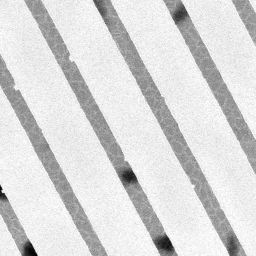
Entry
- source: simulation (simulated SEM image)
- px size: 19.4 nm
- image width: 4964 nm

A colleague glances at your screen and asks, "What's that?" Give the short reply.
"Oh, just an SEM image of one or a few lines or trenches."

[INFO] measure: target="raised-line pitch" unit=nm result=1190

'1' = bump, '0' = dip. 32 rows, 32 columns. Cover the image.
11100111111100111111100111111001
11110011111100011111100111111100
11110001111110011111110011111100
11111001111110001111110011111110
11111000111111001111111001111110
11111100111111100111111000111111
11111100011111100111111100111111
11111110011111100011111100011111
01111110001111110011111110011111
00111111001111111001111110001111
00111111100111111000111111001111
00011111100111111100111111000111
10011111110011111100011111100111
10001111110011111110011111110011
11001111111001111110001111110011
11100111111000111111001111111001
11100111111100111111000111111000
11110011111100011111100111111100
11110011111110011111110011111100
11111001111110001111110011111110
11111001111111001111110001111110
11111100111111000111111001111111
11111100011111100111111100111111
11111110011111100011111101111111
01111111001111110011111111111111
01111111001111110001111110011111
00111111000111111001111111001111
00111111100111111100111111000111
10011111100011111100111111100111
10011111110011111110011111100011
11001111111001111110001111110011
11000111111001111111001111110001